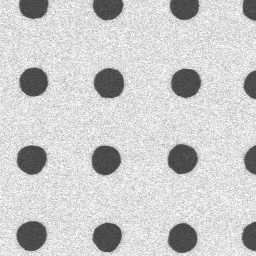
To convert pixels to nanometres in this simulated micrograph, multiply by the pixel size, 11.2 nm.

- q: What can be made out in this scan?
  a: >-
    a regular array of holes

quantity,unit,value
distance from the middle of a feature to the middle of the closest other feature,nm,845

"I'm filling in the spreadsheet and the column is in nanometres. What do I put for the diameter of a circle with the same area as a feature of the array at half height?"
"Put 329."